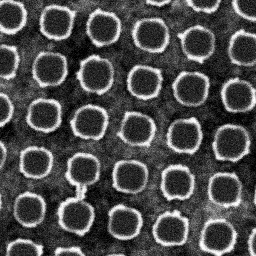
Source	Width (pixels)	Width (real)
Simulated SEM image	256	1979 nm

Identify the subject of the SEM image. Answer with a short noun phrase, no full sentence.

a regular array of raised bodies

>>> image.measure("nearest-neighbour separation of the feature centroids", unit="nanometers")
361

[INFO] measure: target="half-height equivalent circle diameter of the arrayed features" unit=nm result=274